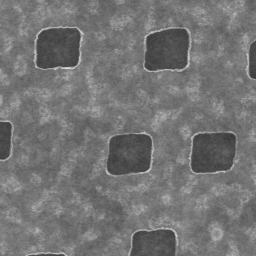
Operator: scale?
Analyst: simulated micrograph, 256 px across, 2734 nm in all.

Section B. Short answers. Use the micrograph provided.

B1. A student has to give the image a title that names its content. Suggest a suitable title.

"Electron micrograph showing holes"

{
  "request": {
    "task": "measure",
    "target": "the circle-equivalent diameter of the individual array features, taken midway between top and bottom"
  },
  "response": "488 nm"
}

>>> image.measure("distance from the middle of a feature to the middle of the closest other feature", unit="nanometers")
1030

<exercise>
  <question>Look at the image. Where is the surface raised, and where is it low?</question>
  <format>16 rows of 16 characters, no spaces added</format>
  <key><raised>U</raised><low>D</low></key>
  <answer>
UUUUUUUUUUUUUUUU
UUUUUUUUUUUUUUUU
UUDDDUUUUDDDUUUU
UUDDDUUUUDDDUUUU
UUUUUUUUUUUUUUUU
UUUUUUUUUUUUUUUU
UUUUUUUUUUUUUUUU
UUUUUUUUUUUUUUUU
DUUUUUUDDUUUDDUU
DUUUUUUDDUUUDDDU
UUUUUUUDDUUUDDUU
UUUUUUUUUUUUUUUU
UUUUUUUUUUUUUUUU
UUUUUUUUUUUUUUUU
UUUUUUUUUDDUUUUU
UUUUUUUUDDDUUUUU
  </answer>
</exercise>